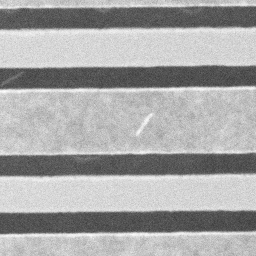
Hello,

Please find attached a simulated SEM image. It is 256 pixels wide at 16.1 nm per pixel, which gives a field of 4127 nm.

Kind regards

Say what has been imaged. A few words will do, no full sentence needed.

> lines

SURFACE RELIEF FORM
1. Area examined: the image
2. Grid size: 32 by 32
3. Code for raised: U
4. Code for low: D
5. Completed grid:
UUUUUUUUUUUUUUUUUUUUUUUUUUUUUUUU
DDDDDDDDDDDDDDDDDDDDDDDDDDDDDDDD
DDDDDDDDDDDDDDDDDDDDDDDDDDDDDDDD
DDDDDDDDDDDDDDDDDDDDDDDDDDDDDDDD
UUUUUUUUUUUUUUUUUUUUUUUUUUUUUUUU
UUUUUUUUUUUUUUUUUUUUUUUUUUUUUUUU
UUUUUUUUUUUUUUUUUUUUUUUUUUUUUUUU
UUUUUUUUUUUUUUUUUUUUUUUUUUUUUUUU
DDDDDDDDDDDDDDDDDDDDDDDDDDDDDDDD
DDDDDDDDDDDDDDDDDDDDDDDDDDDDDDDD
DDDDDDDDDDDDDDDDDDDDDDDDDDDDDDDD
UUUUUUUUUUUUUUUUUUUUUUUUUUUUUUUU
UUUUUUUUUUUUUUUUUUUUUUUUUUUUUUUU
UUUUUUUUUUUUUUUUUUUUUUUUUUUUUUUU
UUUUUUUUUUUUUUUUUUUUUUUUUUUUUUUU
UUUUUUUUUUUUUUUUUUUUUUUUUUUUUUUU
UUUUUUUUUUUUUUUUUUUUUUUUUUUUUUUU
UUUUUUUUUUUUUUUUUUUUUUUUUUUUUUUU
UUUUUUUUUUUUUUUUUUUUUUUUUUUUUUUU
DDDDDDDDDDDDDDDDDDDDDDDDDDDDDDDD
DDDDDDDDDDDDDDDDDDDDDDDDDDDDDDDD
DDDDDDDDDDDDDDDDDDDDDDDDDDDDDDDD
UUUUUUUUUUUUUUUUUUUUUUUUUUUUUUUU
UUUUUUUUUUUUUUUUUUUUUUUUUUUUUUUU
UUUUUUUUUUUUUUUUUUUUUUUUUUUUUUUU
UUUUUUUUUUUUUUUUUUUUUUUUUUUUUUUU
DUDDDDDDDDDDDDDDDDDDDDDDDDDDDDDD
DDDDDDDDDDDDDDDDDDDDDDDDDDDDDDDD
DDDDDDDDDDDDDDDDDDDDDDDDDDDDDDDD
UUUUUUUUUUUUUUUUUUUUUUUUUUUUUUUU
UUUUUUUUUUUUUUUUUUUUUUUUUUUUUUUU
UUUUUUUUUUUUUUUUUUUUUUUUUUUUUUUU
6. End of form